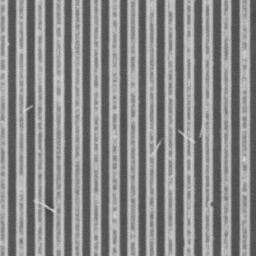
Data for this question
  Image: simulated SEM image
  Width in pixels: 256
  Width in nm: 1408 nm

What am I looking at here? parallel lines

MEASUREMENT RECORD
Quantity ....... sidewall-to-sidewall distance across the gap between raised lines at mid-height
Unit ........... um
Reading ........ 0.0619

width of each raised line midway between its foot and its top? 41.3 nm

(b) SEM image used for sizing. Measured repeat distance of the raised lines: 18.6 pixels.